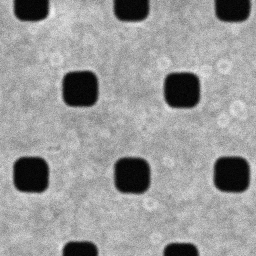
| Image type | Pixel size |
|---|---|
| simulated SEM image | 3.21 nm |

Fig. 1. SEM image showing holes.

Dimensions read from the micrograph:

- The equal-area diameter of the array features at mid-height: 124 nm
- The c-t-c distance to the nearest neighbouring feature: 317 nanometres